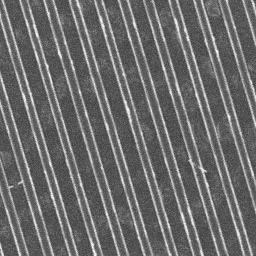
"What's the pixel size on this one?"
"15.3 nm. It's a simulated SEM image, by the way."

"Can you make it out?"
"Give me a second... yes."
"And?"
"parallel lines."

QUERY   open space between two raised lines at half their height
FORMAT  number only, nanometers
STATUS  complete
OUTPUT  234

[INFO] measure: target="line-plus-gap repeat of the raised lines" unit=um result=0.366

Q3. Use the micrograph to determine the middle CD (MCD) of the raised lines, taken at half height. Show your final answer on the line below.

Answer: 129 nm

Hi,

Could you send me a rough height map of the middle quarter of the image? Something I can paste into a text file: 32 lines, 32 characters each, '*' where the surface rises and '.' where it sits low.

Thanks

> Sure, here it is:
**....**.....*....***....**....*
***...**.....**....**....**....*
***....**....**....**....***....
.**....**....**....***....**....
.**....**.....**....**....**....
.***....**....**....**....***...
..**....**....**....***...***...
..**....**.....**....**....**...
..***....**....**....**....**...
...**....**....**....**....***..
...**....**....**....***....**..
...**....**.....**....**....**..
...***....**....**....**....***.
....**....**....**....***....**.
....**....**....***....**....**.
....***....**....**....**....***
....***....**....**....***....**
*....**....**....***...***....**
*....**....**.....**....**....**
*....***....**....**....**....**
**....**....**....**....***....*
**....**....**.....**....**....*
**....***....**....**....**....*
**.....**....**....**....***....
.**....**....**.....**...***....
.**....***....**....**....**....
.**....***....**....**....**....
..**....**....**....***...***...
..**....**....**.....**....**...
..**....***....**....**....**...
...*.....**....**....**....***..
...**....**....**.....**....**..